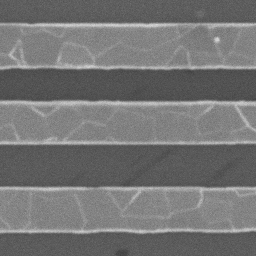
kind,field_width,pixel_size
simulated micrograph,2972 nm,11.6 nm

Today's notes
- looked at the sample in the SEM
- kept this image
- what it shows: lines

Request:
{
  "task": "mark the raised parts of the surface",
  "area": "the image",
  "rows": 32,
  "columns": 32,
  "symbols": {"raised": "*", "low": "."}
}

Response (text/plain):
................................
................................
................................
********************************
********************************
********************************
********************************
********************************
*****..*************************
................................
................................
................................
................................
********************************
********************************
********************************
********************************
********************************
................................
................................
................................
................................
................................
****........***.**.******....**.
********************************
********************************
********************************
********************************
********************************
................................
................................
................................